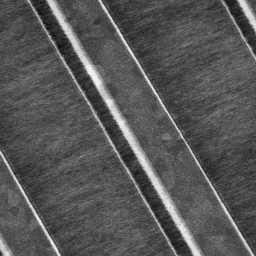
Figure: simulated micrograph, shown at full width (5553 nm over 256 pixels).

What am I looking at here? lines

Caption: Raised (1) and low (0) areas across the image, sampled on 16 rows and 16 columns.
0001111000000001
0000111000000000
0000111100000000
0000011100000000
0000001110000000
0000001111000000
0000000111000000
0000000111100000
0000000011100000
0000000001110000
1000000001111000
1000000000111000
1100000000111100
1100000000011100
1110000000011110
1111000000001111